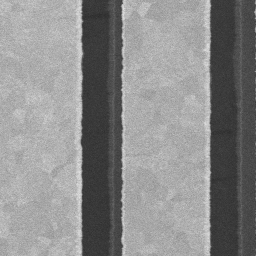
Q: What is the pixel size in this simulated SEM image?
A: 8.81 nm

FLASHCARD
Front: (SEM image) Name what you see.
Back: lines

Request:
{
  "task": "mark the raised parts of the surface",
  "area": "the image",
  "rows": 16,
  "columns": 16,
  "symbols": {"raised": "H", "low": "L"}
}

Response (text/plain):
HHHHHLLLHHHHHLLL
HHHHHLLLHHHHHLLL
HHHHHLLLHHHHHLLL
HHHHHLLLHHHHHLLL
HHHHHLLLHHHHHLLL
HHHHHLLLHHHHHLLL
HHHHHLLLHHHHHLLL
HHHHHLLLHHHHHLLL
HHHHHLLLHHHHHLLL
HHHHHLLLHHHHHLLL
HHHHHLLLHHHHHLLL
HHHHHLLLHHHHHLLL
HHHHHLLLHHHHHLLL
HHHHHLLLHHHHHLLL
HHHHHLLLHHHHHLLL
HHHHHLLLHHHHHLLL